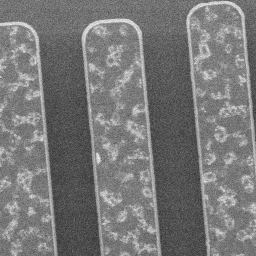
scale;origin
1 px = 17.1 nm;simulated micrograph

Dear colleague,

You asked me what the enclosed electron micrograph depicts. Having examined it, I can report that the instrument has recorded one or a few lines or trenches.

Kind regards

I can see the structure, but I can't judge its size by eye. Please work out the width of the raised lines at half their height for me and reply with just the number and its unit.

0.976 micrometres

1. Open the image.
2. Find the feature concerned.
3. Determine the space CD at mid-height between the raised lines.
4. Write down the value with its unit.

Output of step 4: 804 nm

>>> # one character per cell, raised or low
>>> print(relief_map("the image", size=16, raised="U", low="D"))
DDDDDDDDDDDDUUUD
UDDDDDUUDDDDUUUD
UUDDDUUUUDDDUUUD
UUDDDUUUUDDDUUUD
UUUDDUUUUDDDUUUU
UUUDDUUUUDDDUUUU
UUUDDDUUUDDDUUUU
UUUDDDUUUDDDUUUU
UUUDDDUUUDDDUUUU
UUUDDDUUUDDDUUUU
UUUDDDUUUUDDDUUU
UUUDDDUUUUDDDUUU
UUUDDDUUUUDDDUUU
UUUDDDUUUUDDDUUU
UUUDDDUUUUDDDUUU
UUUDDDUUUUDDDUUU